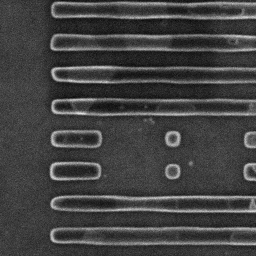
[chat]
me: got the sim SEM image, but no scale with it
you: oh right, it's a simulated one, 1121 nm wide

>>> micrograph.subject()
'wiring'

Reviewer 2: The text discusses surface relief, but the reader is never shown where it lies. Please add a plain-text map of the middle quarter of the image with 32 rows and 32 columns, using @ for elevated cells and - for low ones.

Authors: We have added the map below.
--------------------------------
@@@@@@@@@@@@@@@@@@@@@@@@@@@@@@@@
@@@@@@@@@@@@@@@@@@@@@@@@@@@@@@@@
@@@@@@@@@@@@@@@@@@@@@@@@@@@@@@@@
---------@@@@-------------------
--------------------------------
--------------------------------
--------------------------------
--------------------------------
@@@@@@@@@@@@@@@@@@@@@@@@@@@@@@@@
@@@@@@@@@@@@@@@@@@@@@@@@@@@@@@@@
@@@@@@@@@@@@@@@@@@@@@@@@@@@@@@@@
---------@@@@-------------------
--------------------------------
--------------------------------
--------------------------------
--------------------------------
@@@@@@@@@-----------------@@----
@@@@@@@@@-----------------@@@---
@@@@@@@@@-----------------@@----
@----@@@------------------------
--------------------------------
--------------------------------
--------------------------------
--------------------------------
@@@@@@@@@------------------@----
@@@@@@@@@-----------------@@@---
@@@@@@@@@-----------------@@@---
@@@@@@@@------------------------
--------------------------------
--------------------------------
--------------------------------